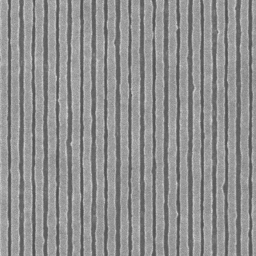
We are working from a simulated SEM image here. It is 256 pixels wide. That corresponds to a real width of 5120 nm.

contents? parallel lines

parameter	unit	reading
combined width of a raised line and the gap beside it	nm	242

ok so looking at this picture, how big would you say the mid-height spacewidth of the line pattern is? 72.5 nanometers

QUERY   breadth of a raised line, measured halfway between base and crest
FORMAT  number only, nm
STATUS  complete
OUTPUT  162